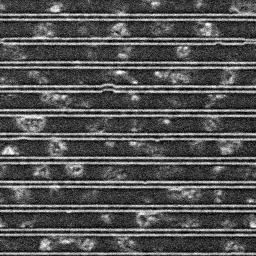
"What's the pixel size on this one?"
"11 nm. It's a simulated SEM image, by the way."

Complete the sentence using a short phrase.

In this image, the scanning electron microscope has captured parallel lines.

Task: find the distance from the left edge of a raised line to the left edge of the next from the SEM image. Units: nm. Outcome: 262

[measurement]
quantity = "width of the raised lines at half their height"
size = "57.5 nanometres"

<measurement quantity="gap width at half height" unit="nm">201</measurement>